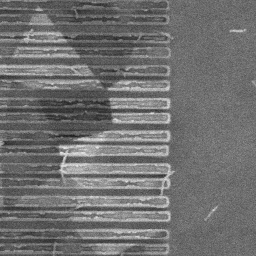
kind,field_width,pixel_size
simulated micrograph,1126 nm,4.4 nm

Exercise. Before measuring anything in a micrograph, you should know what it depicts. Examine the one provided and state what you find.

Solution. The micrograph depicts parallel lines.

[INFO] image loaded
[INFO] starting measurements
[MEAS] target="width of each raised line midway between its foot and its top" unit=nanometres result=42.9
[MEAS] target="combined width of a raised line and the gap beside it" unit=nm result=72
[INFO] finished